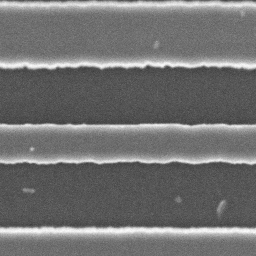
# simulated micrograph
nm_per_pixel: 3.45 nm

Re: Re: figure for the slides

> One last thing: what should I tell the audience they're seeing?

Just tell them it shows lines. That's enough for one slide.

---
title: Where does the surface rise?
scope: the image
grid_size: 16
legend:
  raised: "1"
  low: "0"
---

1111111111111111
1111111111111111
1111111111111111
1111111111111111
0000000000000000
0000000000000000
0000000000000000
0000000000000000
1111111111111111
1111111111111111
0000000000000000
0000000000000000
0000000000000000
0000000000000000
1111111111111111
1111111111111111